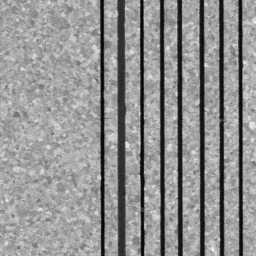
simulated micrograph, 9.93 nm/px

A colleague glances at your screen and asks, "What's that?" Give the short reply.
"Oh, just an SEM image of parallel lines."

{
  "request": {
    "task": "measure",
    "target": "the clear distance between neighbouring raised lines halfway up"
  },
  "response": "48.4 nanometres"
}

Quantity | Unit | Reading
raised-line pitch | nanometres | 199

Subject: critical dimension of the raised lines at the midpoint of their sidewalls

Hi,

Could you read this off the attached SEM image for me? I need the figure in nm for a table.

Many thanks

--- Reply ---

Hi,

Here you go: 146